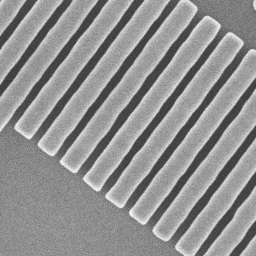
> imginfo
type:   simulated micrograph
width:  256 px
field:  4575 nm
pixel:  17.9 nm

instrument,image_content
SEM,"groups of lines, slits or small figures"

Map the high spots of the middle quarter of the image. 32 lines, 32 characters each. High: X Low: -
XXXXX---XXXXXX---XXXXXX---XXXXXX
XXXX---XXXXXXX--XXXXXX---XXXXXX-
XXXX--XXXXXXX--XXXXXX---XXXXXX--
XXX---XXXXXX---XXXXX----XXXXXX--
XX---XXXXXX---XXXXXX---XXXXXX---
X---XXXXXX---XXXXXX---XXXXXX---X
X--XXXXXXX--XXXXXXX--XXXXXX---XX
---XXXXXX---XXXXXX---XXXXXX--XXX
--XXXXXX---XXXXXX---XXXXXX---XXX
-XXXXXX---XXXXXX---XXXXXX---XXXX
XXXXXXX--XXXXXXX---XXXXX---XXXXX
XXXXXX---XXXXXX---XXXXXX---XXXXX
XXXXX---XXXXXX---XXXXXX---XXXXXX
XXXXX--XXXXXX---XXXXXX---XXXXXX-
XXXX--XXXXXXX--XXXXXXX--XXXXXXX-
XXX---XXXXXX---XXXXXX--XXXXXXX--
XX---XXXXXX---XXXXXX---XXXXXX---
X---XXXXXXX--XXXXXX---XXXXXX---X
---XXXXXXX--XXXXXX---XXXXXX---XX
---XXXXXX---XXXXXX---XXXXXX---XX
--XXXXXX---XXXXXX---XXXXXX---XXX
-XXXXXX---XXXXXX---XXXXXX---XXXX
XXXXXXX--XXXXXXX--XXXXXX---XXXXX
XXXXXX---XXXXXX--XXXXXXX---XXXXX
XXXXX---XXXXXX---XXXXXX---XXXXXX
XXXX---XXXXXXX--XXXXXX---XXXXXX-
-XXX---XXXXXX--XXXXXXX--XXXXXXX-
------XXXXXX--XXXXXXX--XXXXXXX--
-----XXXXXX---XXXXXX---XXXXXX---
-----XXXXX---XXXXXX---XXXXXX---X
-------XXX--XXXXXX---XXXXXX---XX
--------X---XXXXX---XXXXXXX--XXX